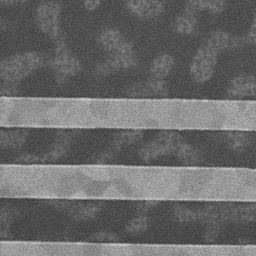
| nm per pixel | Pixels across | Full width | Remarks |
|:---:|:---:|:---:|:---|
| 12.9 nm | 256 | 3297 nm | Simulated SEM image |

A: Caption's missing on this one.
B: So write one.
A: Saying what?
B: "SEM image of one or a few lines or trenches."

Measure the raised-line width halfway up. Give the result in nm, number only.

398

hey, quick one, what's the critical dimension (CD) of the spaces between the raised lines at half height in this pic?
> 518 nm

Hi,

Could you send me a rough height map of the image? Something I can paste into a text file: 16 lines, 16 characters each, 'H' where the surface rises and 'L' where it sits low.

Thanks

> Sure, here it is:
LLLLLLLLLLLLLLLL
LLLLLLLLLLLLLLLL
LLLLLLLLLLLLLLLL
LLLLLLLLLLLLLLLL
LLLLLLLLLLLLLLLL
LLLLLLLLLLLLLLLL
HHHHHHHHHHHHHHHH
HHHHHHHHHHHHHHHH
LLLLLLLLLLLLLLLL
LLLLLLLLLLLLLLLL
HHHHHHHHHHLLHHLL
HHHHHHHHHHHHHHHH
LLLLLLLLLLLLLLHH
LLLLLLLLLLLLLLLL
LLLLLLLLLLLLLLLL
HHHHHHHHHHHHHHHH